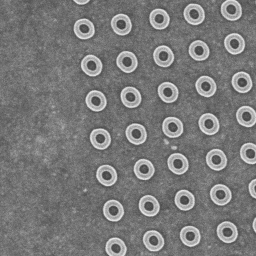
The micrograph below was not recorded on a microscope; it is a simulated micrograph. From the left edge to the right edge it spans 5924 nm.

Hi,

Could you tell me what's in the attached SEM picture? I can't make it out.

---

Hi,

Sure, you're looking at a regular array of ring-shaped raised bodies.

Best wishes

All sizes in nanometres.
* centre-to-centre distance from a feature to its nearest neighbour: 828